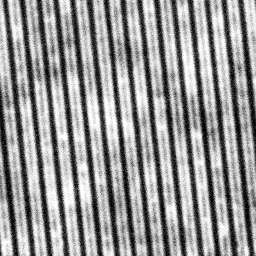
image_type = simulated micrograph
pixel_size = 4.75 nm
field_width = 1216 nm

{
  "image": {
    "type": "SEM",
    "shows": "parallel lines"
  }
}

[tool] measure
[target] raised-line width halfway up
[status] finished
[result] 43.1 nm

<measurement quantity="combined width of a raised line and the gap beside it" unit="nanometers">79.4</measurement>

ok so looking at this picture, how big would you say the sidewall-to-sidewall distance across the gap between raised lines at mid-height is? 39 nanometres